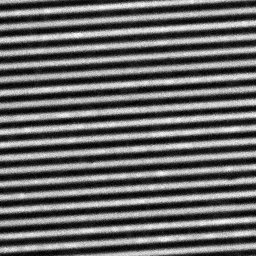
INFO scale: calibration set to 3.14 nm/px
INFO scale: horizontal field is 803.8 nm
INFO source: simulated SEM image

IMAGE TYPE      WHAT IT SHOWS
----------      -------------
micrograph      parallel lines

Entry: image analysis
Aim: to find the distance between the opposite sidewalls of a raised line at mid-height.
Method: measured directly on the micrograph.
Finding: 5.86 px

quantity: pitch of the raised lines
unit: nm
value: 41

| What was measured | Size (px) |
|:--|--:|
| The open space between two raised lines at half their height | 6.85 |